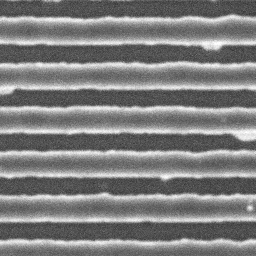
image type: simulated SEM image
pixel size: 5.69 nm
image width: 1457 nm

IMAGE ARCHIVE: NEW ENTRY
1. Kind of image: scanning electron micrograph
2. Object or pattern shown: lines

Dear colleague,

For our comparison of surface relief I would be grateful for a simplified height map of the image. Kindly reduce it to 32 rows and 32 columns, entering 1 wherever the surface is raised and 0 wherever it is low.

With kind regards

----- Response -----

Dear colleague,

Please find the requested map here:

00000000000000000000000000000000
00000000000000000000000000000000
11111111111111111111111111111111
11111111111111111111111111111111
11111111111111111111111111111111
00000000000000000000000100000000
00000000000000000000000000000000
00000000000000000000000000000000
11111111111111111111111111111111
11111111111111111111111111111111
11111111111111111111111111111111
00000000000000000000000000000000
00000000000000000000000000000000
00111000011111100001111000000000
11111111111111111111111111111111
11111111111111111111111111111111
11111111111111101111111111111111
00000000000000000000000000000000
00000000000000000000000000000000
11111111111111111111111111111111
11111111111111111111111111111111
11111111111111111111111111111111
00000000000000000000000000000000
00000000000000000000000000000000
00101100011111000111111111110111
11111111111111111111111111111111
11111111111111111111111111111111
11111111111111111111111111111111
00000000000000000000000000000000
00000000000000000000000000000000
11111111111111111111111111111111
11111111111111111111111111111111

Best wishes